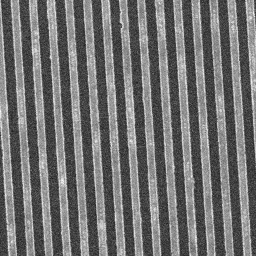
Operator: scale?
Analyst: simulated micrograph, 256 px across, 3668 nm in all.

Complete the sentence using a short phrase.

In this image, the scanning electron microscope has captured parallel lines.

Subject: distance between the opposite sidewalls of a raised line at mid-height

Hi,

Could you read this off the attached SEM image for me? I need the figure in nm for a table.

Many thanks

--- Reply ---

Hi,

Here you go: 98.3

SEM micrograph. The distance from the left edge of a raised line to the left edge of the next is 0.258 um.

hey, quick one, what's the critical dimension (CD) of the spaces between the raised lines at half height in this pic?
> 159 nanometres